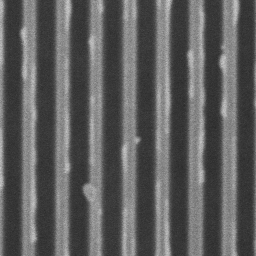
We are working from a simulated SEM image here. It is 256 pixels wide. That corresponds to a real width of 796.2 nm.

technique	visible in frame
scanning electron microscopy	parallel lines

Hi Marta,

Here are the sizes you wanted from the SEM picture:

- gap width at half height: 52.9 nm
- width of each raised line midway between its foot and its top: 50.2 nm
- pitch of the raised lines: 104 nm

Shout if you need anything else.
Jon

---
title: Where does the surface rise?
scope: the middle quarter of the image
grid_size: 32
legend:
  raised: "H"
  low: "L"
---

HLLLLLHHHHLLLLHHHHLLLLLHHHHLLLLH
HLLLLLHHHHLLLLHHHHLLLLLHHHHLLLLH
HLLLLLHHHHLLLLHHHHLLLLLHHHHLLLLH
HLLLLLHHHHLLLLHHHHLLLLLHHHHLLLLH
HLLLLLHHHHLLLLHHHHLLLLLHHHHLLLLH
HLLLLLHHHHLLLLHHHHLLLLLHHHHLLLLH
HLLLLLHHHHLLLLHHHHLLLLLHHHHLLLLH
HLLLLLHHHHLLLLHHHHLLLLLHHHLLLLLH
HLLLLLHHHHLLLLLHHHLLLLLHHHLLLLLH
HLLLLLHHHHLLLLLHHHLLLLLHHHLLLLLH
HLLLLLHHHHLLLLLHHHLLLLLHHHLLLLLH
HLLLLLHHHHLLLLLHHHLLLLLHHHLLLLLH
HLLLLLHHHHLLLLLHHHLLLLLHHHLLLLLH
HLLLLLHHHHLLLLHHHHLLLLLHHHLLLLLH
HLLLLLHHHHLLLLHHHHLLLLLHHHLLLLLH
HLLLLLHHHHLLLLHHHHLLLLLHHHLLLLLH
HLLLLLHHHHLLLLHHHHLLLLLHHHLLLLLH
HLLLLLHHHHLLLLHHHHLLLLLHHHLLLLLH
HLLLLLHHHHLLLLLHHHHLLLLHHHLLLLLH
HLLLLLHHHHLLLLHHHHHLLLLHHHLLLLLH
HLLLLLHHHHLLLLHHHHLLLLLHHHLLLLLH
HLLLLLHHHHLLLLHHHHLLLLLHHHLLLLLH
HLLLLLHHHHLLLLHHHHLLLLLHHHLLLLLH
HLLLLLHHHHLLLLHHHHLLLLLHHHLLLLLH
HLLLLLHHHHLLLLHHHHLLLLLHHHLLLLLH
HHLLLLHHHHLLLLHHHHLLLLLHHHLLLLLH
HHLLLLHHHHLLLLHHHHLLLLLHHHLLLLLH
HLLLLLHHHHLLLLHHHHLLLLLHHHLLLLLH
HLLLLLHHHHLLLLHHHHLLLLLHHHLLLLLH
HLLLLLHHHHLLLLHHHHLLLLLHHHLLLLLH
HLLLLHHHHHLLLLHHHHLLLLLHHHLLLLLH
HLLLLHHHHHLLLLHHHHLLLLLHHHLLLLLH